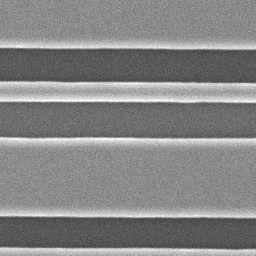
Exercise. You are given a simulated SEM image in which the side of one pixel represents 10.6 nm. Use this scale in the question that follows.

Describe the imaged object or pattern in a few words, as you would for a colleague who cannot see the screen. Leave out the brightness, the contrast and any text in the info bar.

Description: lines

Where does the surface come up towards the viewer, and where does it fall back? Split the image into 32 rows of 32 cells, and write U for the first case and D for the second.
UUUUUUUUUUUUUUUUUUUUUUUUUUUUUUUU
UUUUUUUUUUUUUUUUUUUUUUUUUUUUUUUU
UUUUUUUUUUUUUUUUUUUUUUUUUUUUUUUU
UUUUUUUUUUUUUUUUUUUUUUUUUUUUUUUU
UUUUUUUUUUUUUUUUUUUUUUUUUUUUUUUU
UUUUUUUUUUUUUUUUUUUUUUUUUUUUUUUU
DDDDDDDDDDDDDDDDDDDDDDDDDDDDDDDD
DDDDDDDDDDDDDDDDDDDDDDDDDDDDDDDD
DDDDDDDDDDDDDDDDDDDDDDDDDDDDDDDD
DDDDDDDDDDDDDDDDDDDDDDDDDDDDDDDD
UUUUUUUUUUUUUUUUUUUUUUUUUUUUUUUU
UUUUUUUUUUUUUUUUUUUUUUUUUUUUUUUU
UUUUUUUUUUUUUUUUUUUUUUUUUUUUUUUU
DDDDDDDDDDDDDDDDDDDDDDDDDDDDDDDD
DDDDDDDDDDDDDDDDDDDDDDDDDDDDDDDD
DDDDDDDDDDDDDDDDDDDDDDDDDDDDDDDD
DDDDDDDDDDDDDDDDDDDDDDDDDDDDDDDD
UUUUUUUUUUUUUUUUUUUUUUUUUUUUUUUU
UUUUUUUUUUUUUUUUUUUUUUUUUUUUUUUU
UUUUUUUUUUUUUUUUUUUUUUUUUUUUUUUU
UUUUUUUUUUUUUUUUUUUUUUUUUUUUUUUU
UUUUUUUUUUUUUUUUUUUUUUUUUUUUUUUU
UUUUUUUUUUUUUUUUUUUUUUUUUUUUUUUU
UUUUUUUUUUUUUUUUUUUUUUUUUUUUUUUU
UUUUUUUUUUUUUUUUUUUUUUUUUUUUUUUU
UUUUUUUUUUUUUUUUUUUUUUUUUUUUUUUU
UUUUUUUUUUUUUUUUUUUUUUUUUUUUUUUU
DDDDDDDDDDDDDDDDDDDDDDDDDDDDDDDD
DDDDDDDDDDDDDDDDDDDDDDDDDDDDDDDD
DDDDDDDDDDDDDDDDDDDDDDDDDDDDDDDD
DDDDDDDDDDDDDDDDDDDDDDDDDDDDDDDD
UUUUUUUUUUUUUUUUUUUUUUUUUUUUUUUU